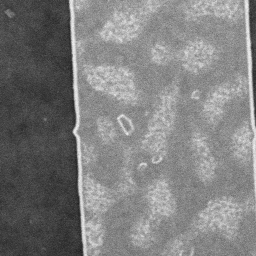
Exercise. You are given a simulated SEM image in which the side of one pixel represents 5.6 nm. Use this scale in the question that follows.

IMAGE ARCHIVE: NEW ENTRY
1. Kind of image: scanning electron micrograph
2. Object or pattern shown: one or a few lines or trenches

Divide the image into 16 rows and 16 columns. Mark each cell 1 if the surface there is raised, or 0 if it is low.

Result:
0000111111111110
0000011111111110
0000011111111111
0000011111111111
0000011111111111
0000011111111111
0000011111111111
0000011111111111
0000011111111111
0000011111111111
0000011111111111
0000011111111111
0000011111111111
0000011111111111
0000011111111111
0000011111111111